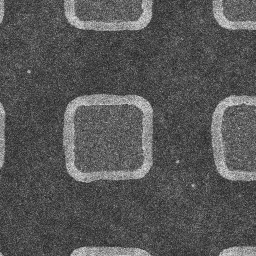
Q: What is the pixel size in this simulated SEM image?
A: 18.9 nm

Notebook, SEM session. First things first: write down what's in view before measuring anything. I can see raised bodies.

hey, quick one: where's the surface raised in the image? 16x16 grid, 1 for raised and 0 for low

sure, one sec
0000111110000011
0000011110000011
0000000000000000
0000000000000000
0000000000000000
0000000000000000
0000011110000011
0000111110000011
0000111110000011
0000111110000011
0000111110000011
0000000000000000
0000000000000000
0000000000000000
0000000000000000
0000000000000000